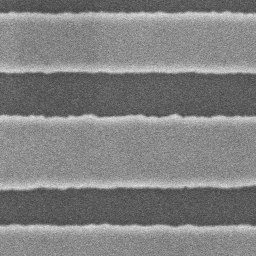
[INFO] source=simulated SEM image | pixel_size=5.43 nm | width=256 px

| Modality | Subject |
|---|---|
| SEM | lines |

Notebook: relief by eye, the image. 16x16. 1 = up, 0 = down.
0000000000000000
1111111111111111
1111111111111111
1111111111111111
1110010100101111
0000000000000000
0000000000000000
1111111111111111
1111111111111111
1111111111111111
1111111111111111
1111111111111111
0000000000000000
0000000000000000
1111111111111111
1111111111111111